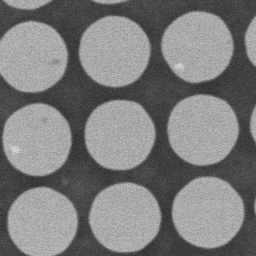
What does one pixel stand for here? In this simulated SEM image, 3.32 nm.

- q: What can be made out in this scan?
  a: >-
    an array of small figures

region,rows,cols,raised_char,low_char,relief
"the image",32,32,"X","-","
-XXXXX--------------------------
------------------------X-------
------------XXXX------XXXXXX----
--XXXX-----XXXXXXX---XXXXXXX---X
XXXXXXX---XXXXXXXX--XXXXXXXXX--X
XXXXXXXX--XXXXXXXXX-XXXXXXXXX--X
XXXXXXXX--XXXXXXXXX-XXXXXXXXX--X
XXXXXXXX--XXXXXXXXX--XXXXXXXX--X
XXXXXXXX--XXXXXXXX---XXXXXXX----
XXXXXXXX---XXXXXX-----XXXXX-----
-XXXXXX------XXX----------------
---X----------------------------
-----------------------XXXXX----
---XXXX-----XXXXXX----XXXXXXX---
-XXXXXXX---XXXXXXXX--XXXXXXXX--X
-XXXXXXX---XXXXXXXX--XXXXXXXXX-X
XXXXXXXXX--XXXXXXXX--XXXXXXXXX-X
XXXXXXXXX--XXXXXXXX--XXXXXXXX---
XXXXXXXXX--XXXXXXXX---XXXXXXX---
-XXXXXXX---XXXXXXX----XXXXXX----
-XXXXXXX-----XXXX-------XX------
---XXXX-------------------------
------------------------XXXX----
-----X-------XXXXX-----XXXXXX---
--XXXXXX----XXXXXXX---XXXXXXXX--
--XXXXXXX---XXXXXXXX--XXXXXXXX--
-XXXXXXXX--XXXXXXXXX--XXXXXXXX--
-XXXXXXXXX-XXXXXXXXX--XXXXXXXX--
-XXXXXXXXX-XXXXXXXXX--XXXXXXXX--
-XXXXXXXX---XXXXXXX----XXXXXX---
--XXXXXXX----XXXXX------XXXX----
---XXXXX-------X----------------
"